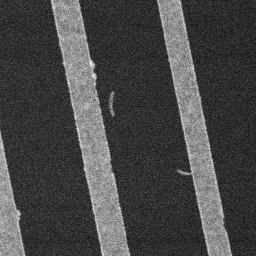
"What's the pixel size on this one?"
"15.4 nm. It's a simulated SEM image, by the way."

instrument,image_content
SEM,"one or a few lines or trenches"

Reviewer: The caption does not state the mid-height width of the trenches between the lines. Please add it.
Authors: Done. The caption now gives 1190 nm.